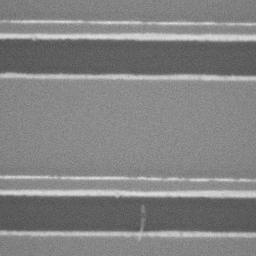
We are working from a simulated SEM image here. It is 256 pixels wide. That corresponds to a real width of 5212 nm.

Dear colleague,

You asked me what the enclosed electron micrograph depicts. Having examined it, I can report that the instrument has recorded lines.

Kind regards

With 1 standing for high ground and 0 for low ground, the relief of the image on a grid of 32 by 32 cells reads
11111111111111111111111111111111
11111111111111111111111111111111
11111111111111111111111111111111
11111111111111111111111111111111
11111111111111111111111111111111
00000000000000000000000000000000
00000000000000000000000000000000
00000000000000000000000000000000
00000000000000000000000000000000
00000000000000000000000000000000
11111111111111111111111111111111
11111111111111111111111111111111
11111111111111111111111111111111
11111111111111111111111111111111
11111111111111111111111111111111
11111111111111111111111111111111
11111111111111111111111111111111
11111111111111111111111111111111
11111111111111111111111111111111
11111111111111111111111111111111
11111111111111111111111111111111
11111111111111111111111111111111
11111111111111111111111111111111
11111111111111111111111111111111
00000000000000000000000000010111
00000000000000000000000000000000
00000000000000000000000000000000
00000000000000000000000000000000
00000000000000000000000000000000
11111111111111111111111111111111
11111111111111111111111111111111
11111111111111111111111111111111